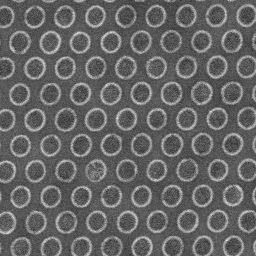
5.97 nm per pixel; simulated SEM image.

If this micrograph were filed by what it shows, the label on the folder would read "a regular array of raised bodies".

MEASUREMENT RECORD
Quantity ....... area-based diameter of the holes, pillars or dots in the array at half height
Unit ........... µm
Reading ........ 0.12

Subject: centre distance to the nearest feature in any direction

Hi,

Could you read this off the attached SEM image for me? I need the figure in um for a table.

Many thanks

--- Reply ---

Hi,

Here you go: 0.175